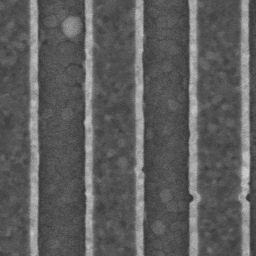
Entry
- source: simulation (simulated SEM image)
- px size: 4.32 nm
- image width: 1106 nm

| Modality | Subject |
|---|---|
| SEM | one or a few lines or trenches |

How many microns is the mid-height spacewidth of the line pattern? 0.233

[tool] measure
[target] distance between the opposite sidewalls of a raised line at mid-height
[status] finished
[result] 51.7 px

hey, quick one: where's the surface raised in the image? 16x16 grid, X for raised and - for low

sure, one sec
XX----XXX---XXX-
XX----XXX---XXX-
XX----XXX---XXX-
XX----XXX---XXX-
XX----XXX---XXX-
XX----XXX---XXX-
XX----XXX---XXX-
XX---XXXX---XXX-
XX----XXX---XXX-
XX----XXX---XXX-
XX----XXX---XXX-
XX----XXX---XXX-
XX----XXX---XXX-
XX----XXX---XXX-
XX----XXX---XXX-
XX----XXX---XXX-